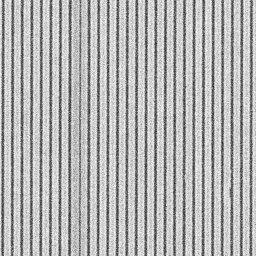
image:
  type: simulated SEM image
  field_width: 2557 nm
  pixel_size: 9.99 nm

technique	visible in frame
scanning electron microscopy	parallel lines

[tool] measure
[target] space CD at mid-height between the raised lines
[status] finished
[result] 3.5 px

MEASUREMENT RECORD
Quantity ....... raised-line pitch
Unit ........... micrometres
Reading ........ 0.0954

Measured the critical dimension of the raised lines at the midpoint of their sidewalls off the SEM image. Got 0.0612 µm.